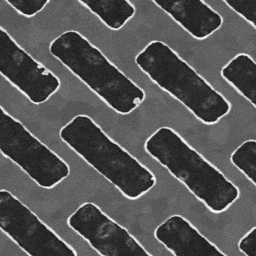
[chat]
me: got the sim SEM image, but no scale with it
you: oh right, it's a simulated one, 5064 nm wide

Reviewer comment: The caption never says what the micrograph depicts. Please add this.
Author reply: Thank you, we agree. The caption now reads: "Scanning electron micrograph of holes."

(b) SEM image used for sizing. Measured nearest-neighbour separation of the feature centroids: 1690 nm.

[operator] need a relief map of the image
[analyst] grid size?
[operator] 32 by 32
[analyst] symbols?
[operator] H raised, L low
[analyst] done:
HLLLLLHHHHHLLLLLHHHHLLLLLLHHLLLL
HHLLLHHHHHHHLLLLLHHHHLLLLLLHHHLL
HHHHHHHHHHHHHLLLHHHHHHLLLLLLHHHL
HHHHHHHHHHHHHHLHHHHHHHHLLLLHHHHH
LHHHHHHHLLHHHHHHHHHHHHHHLLHHHHHH
LLHHHHLLLLLHHHHHHHHLHHHHHHHHHHHH
LLLHHHLLLLLLLHHHHHLLLLHHHHHHHHHH
LLLLHHHHLLLLLHHHHLLLLLLHHHHHHLLL
LLLLLLHHHLLLLLHHHHLLLLLLHHHHLLLL
HLLLLLLHHHLLLLLLHHHLLLLLLHHHLLLL
HHLLLLLHHHHLLLLLLHHHLLLLLLHHHLLL
HHHLLLLHHHHHLLLLLLHHHLLLLLLHHHLL
HHHHLLHHHHHHHLLLLLHHHHLLLLLLHHHL
HHHHHHHHHHHHHHLLLHHHHHHHLLLLLHHH
LHHHHHHHHHHHHHHHHHHHHHHHHLLLHHHH
LLLHHHHHHLLLHHHHHHHHHHHHHHHHHHHH
LLLLHHHHLLLLLHHHHHHHLLHHHHHHHHHH
LLLLLHHHLLLLLLHHHHLLLLLHHHHHHHHH
LLLLLLHHHLLLLLLHHHLLLLLLHHHHHHLL
HLLLLLLHHHLLLLLLHHHLLLLLLHHHHLLL
HHLLLLLLHHHLLLLLLLHHLLLLLLHHHLLL
HHHLLLLLHHHHLLLLLLLHHLLLLLLHHHLL
HHHHLLLLHHHHHHLLLLLHHHLLLLLLHHHL
HHHHHHHHHHHHHHHLLLLHHHHHLLLLLLHH
LLHHHHHHHHHHHHHHLHHHHHHHHLLLLLHH
LLLHHHHHHHHHHHHHHHHHHHHHHHLLLHHH
LLLLHHHHHLLLLHHHHHHHHHHHHHHHHHHH
LLLLLHHHHLLLLLHHHHHHHLLHHHHHHHHH
LLLLLLHHHLLLLLLHHHHHLLLLHHHHHHHH
HLLLLLLHHHLLLLLLHHHLLLLLLHHHHHHL
HHLLLLLLHHHLLLLLLHHHLLLLLLHHHHLL
HHHLLLLLLHHHLLLLLLHHHLLLLLLLHHLL